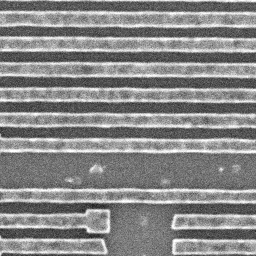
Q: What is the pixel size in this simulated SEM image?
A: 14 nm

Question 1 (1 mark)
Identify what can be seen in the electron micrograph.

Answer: wiring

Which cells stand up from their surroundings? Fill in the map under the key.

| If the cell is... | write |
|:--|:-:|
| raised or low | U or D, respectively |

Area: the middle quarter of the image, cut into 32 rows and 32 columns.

UUUUUUUUUUUUUUUUUUUUUUUUUUUUUUUU
UUUUUUUUUUUUUUUUUUUUUUUUUUUUUUUU
UUUUUUUUUUUUUUUUUUUUUUUUUUUUUUUU
DDDDDDDDDDDDDDDDDDDDDDDDDDDDDDDD
DDDDDDDDDDDDDDDDDDDDDDDDDDDDDDDD
DDDDDDDDDDDDDDDDDDDDDDDDDDDDDDDD
UUUUUUUUUUUUUUUUUUUUUUUUUUUUUUUU
UUUUUUUUUUUUUUUUUUUUUUUUUUUUUUUU
UUUUUUUUUUUUUUUUUUUUUUUUUUUUUUUU
DDDDDDDDDDDDDDDDDDDDDDDDDDDDDDDD
DDDDDDDDDDDDDDDDDDDDDDDDDDDDDDDD
DDDDDDDDDDDDDDDDDDDDDDDDDDDDDDDD
UUDDDUUUUUUUDDDDDDDDDDDDDDDDDDDD
UUUUUUUUUUUUUUUUUUUUUUUUUUUUUUUU
UUUUUUUUUUUUUUUUUUUUUUUUUUUUUUUU
DDDDDDDDUUUUUDDDUUUUUUUUUUUUUUUU
DDDDDDDDDDDDDDDDDDDDDDDDDDDDDDDD
DDDDDDDDDDDDDDDDDDDDDDDDDDDDDDDD
DDDDDDDDDDDDDDDDDDDDDDDDDDDDDDDD
UUUUUUUUUUUUUUUUUUUUUUUUUUUUUUUU
UUUUUUUUUUUUUUUUUUUUUUUUUUUUUUUU
UUUUUUUUUUUUUUUUUUUUUUUUUUUUUUUU
DDDDDDDDDDDDDDDDDDDDDDDDDDDDDDDD
DDDDDDDDDDDDDDDDDDDDDDDDDDDDDDDD
DDDDDDDDDDDDDDDDDDDDDDDDDDDDDDDD
DDDDDDDDDDDDDDDDDDDDDDDDDDDDDDDD
DDDDDDDDDDDDDDDDDDDDDDDDDDDDDDDD
DDDDDDDDDDDDDDDDDDDDDDDDDDDDDDDD
DDDDDDDDDDDDDDDDDDDDDDDDDDDDDDDD
DDDDDDDDDDDDDDDDDDDDDDDDDDDDDDDD
DDDDDDDDDDDDDDDDDDDDDDDDDDDDDDDD
UUDDUUUUDDDUUUUUUUUUDDDDDDDUUUUD